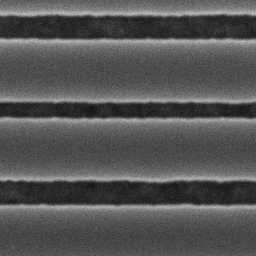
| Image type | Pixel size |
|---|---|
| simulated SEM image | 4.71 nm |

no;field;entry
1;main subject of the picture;lines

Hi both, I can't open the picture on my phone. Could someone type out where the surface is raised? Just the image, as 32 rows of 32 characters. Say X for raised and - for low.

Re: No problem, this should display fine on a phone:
XXXXXXXXXXXXXXXXXXXXXXXXXXXXXXXX
XXXXXXXXXXXXXXXXXXXXXXXXXXXXXXXX
--------------------------------
--------------------------------
--------------------------------
XXXXXXXXXXXXXXXXXXXXXXXXXXXXXXXX
XXXXXXXXXXXXXXXXXXXXXXXXXXXXXXXX
XXXXXXXXXXXXXXXXXXXXXXXXXXXXXXXX
XXXXXXXXXXXXXXXXXXXXXXXXXXXXXXXX
XXXXXXXXXXXXXXXXXXXXXXXXXXXXXXXX
XXXXXXXXXXXXXXXXXXXXXXXXXXXXXXXX
XXXXXXXXXXXXXXXXXXXXXXXXXXXXXXXX
XXXXXXXXXXXXXXXXXXXXXXXXXXXXXXXX
--------------------------------
--------------------------------
XXXXXXXXXXXXXXXXXXXXXXXXXXXXXXXX
XXXXXXXXXXXXXXXXXXXXXXXXXXXXXXXX
XXXXXXXXXXXXXXXXXXXXXXXXXXXXXXXX
XXXXXXXXXXXXXXXXXXXXXXXXXXXXXXXX
XXXXXXXXXXXXXXXXXXXXXXXXXXXXXXXX
XXXXXXXXXXXXXXXXXXXXXXXXXXXXXXXX
XXXXXXXXXXXXXXXXXXXXXXXXXXXXXXXX
XXXXXXX-XX--XX--XXXXXX-X---XX--X
--------------------------------
--------------------------------
--------------------------------
XXXXXXXXXXXXXXXXXXXXXXXXXXXXXXXX
XXXXXXXXXXXXXXXXXXXXXXXXXXXXXXXX
XXXXXXXXXXXXXXXXXXXXXXXXXXXXXXXX
XXXXXXXXXXXXXXXXXXXXXXXXXXXXXXXX
XXXXXXXXXXXXXXXXXXXXXXXXXXXXXXXX
XXXXXXXXXXXXXXXXXXXXXXXXXXXXXXXX